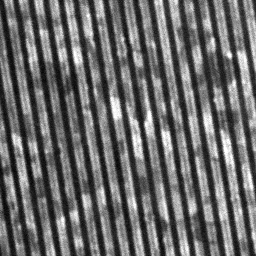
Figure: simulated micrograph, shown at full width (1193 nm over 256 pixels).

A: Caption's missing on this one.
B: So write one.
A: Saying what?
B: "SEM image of parallel lines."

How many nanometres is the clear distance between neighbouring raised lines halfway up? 36.3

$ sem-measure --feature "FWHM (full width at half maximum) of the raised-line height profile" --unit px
7.02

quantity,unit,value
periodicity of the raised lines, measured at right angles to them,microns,0.0686